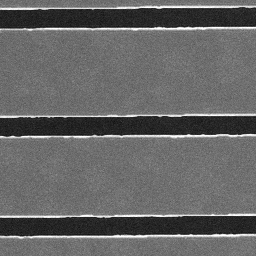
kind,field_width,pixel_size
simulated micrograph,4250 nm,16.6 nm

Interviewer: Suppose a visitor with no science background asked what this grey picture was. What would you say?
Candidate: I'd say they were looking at lines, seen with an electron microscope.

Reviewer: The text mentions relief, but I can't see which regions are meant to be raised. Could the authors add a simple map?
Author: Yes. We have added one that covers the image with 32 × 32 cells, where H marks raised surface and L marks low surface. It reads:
HHHHHHHHHHHHHHHHHHHHHHHHHHHHHHHH
LLLLLLLLLLLLLLLLLLLLLLLLLLLLLLLL
LLLLLLLLLLLLLLLLLLLLLLLLLLLLLLLL
LLLLLLLLLLLLLLLLLLLLLLLLLLHHHHHH
HHHHHHHHHHHHHHHHHHHHHHHHHHHHHHHH
HHHHHHHHHHHHHHHHHHHHHHHHHHHHHHHH
HHHHHHHHHHHHHHHHHHHHHHHHHHHHHHHH
HHHHHHHHHHHHHHHHHHHHHHHHHHHHHHHH
HHHHHHHHHHHHHHHHHHHHHHHHHHHHHHHH
HHHHHHHHHHHHHHHHHHHHHHHHHHHHHHHH
HHHHHHHHHHHHHHHHHHHHHHHHHHHHHHHH
HHHHHHHHHHHHHHHHHHHHHHHHHHHHHHHH
HHHHHHHHHHHHHHHHHHHHHHHHHHHHHHHH
HHHHHHHHHHHHHHHHHHHHHHHHHHHHHHHH
HHHHHHHHHHHHHHHHHLLLLHLLLLLLLLLL
LLLLLLLLLLLLLLLLLLLLLLLLLLLLLLLL
LLLLLLLLLLLLLLLLLLLLLLLLLLLLLLLL
HHHHHHHHHHHHHHHHHHHHHHHHHHHHHHHH
HHHHHHHHHHHHHHHHHHHHHHHHHHHHHHHH
HHHHHHHHHHHHHHHHHHHHHHHHHHHHHHHH
HHHHHHHHHHHHHHHHHHHHHHHHHHHHHHHH
HHHHHHHHHHHHHHHHHHHHHHHHHHHHHHHH
HHHHHHHHHHHHHHHHHHHHHHHHHHHHHHHH
HHHHHHHHHHHHHHHHHHHHHHHHHHHHHHHH
HHHHHHHHHHHHHHHHHHHHHHHHHHHHHHHH
HHHHHHHHHHHHHHHHHHHHHHHHHHHHHHHH
HHHHHHHHHHHHHHHHHHHHHHHHHHHHHHHH
LLLLLLLLLLLLLLLLLLLLLLLLLLLLLLLL
LLLLLLLLLLLLLLLLLLLLLLLLLLLLLLLL
LLLLLLLLLLLLLLLLLLHHHHHHHHHHHHHH
HHHHHHHHHHHHHHHHHHHHHHHHHHHHHHHH
HHHHHHHHHHHHHHHHHHHHHHHHHHHHHHHH